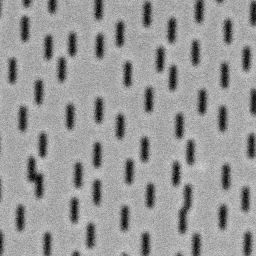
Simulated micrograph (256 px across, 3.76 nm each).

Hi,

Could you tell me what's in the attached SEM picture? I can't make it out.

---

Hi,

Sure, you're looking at a regular array of holes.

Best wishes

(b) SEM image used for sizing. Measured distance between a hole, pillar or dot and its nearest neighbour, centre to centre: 102 nanometers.